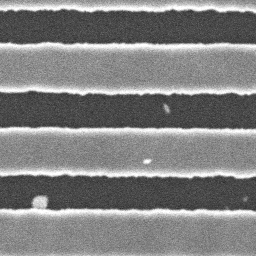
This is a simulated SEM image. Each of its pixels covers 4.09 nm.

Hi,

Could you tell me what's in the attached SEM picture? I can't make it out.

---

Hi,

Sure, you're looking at lines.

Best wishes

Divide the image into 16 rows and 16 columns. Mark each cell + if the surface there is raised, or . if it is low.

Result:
++++++++++++++++
................
................
++++++++++++++++
++++++++++++++++
++++++++++++++++
................
................
++++++++++++++++
++++++++++++++++
++++++++++++++++
................
................
++++++++++++++++
++++++++++++++++
++++++++++++++++